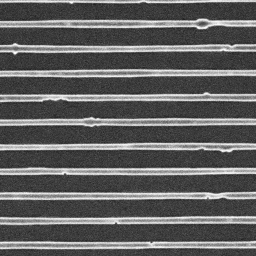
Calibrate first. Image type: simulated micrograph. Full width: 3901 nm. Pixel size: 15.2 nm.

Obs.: parallel lines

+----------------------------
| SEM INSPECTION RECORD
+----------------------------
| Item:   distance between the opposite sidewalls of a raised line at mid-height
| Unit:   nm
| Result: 87.6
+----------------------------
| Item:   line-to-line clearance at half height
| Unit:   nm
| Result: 288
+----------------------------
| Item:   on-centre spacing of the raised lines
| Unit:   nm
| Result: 375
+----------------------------